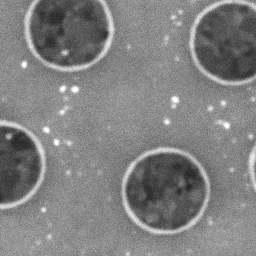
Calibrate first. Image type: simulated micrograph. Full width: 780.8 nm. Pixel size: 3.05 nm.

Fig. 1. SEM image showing raised bodies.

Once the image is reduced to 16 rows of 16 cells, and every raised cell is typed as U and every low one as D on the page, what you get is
DDUUUUUDDDDDDUUU
DDUUUUUDDDDDUUUU
DDUUUUUDDDDDUUUU
DDUUUUDDDDDDUUUU
DDDDDDDDDDDDDUUU
DDDDDDDDDDDDDDDD
DDDDDDDDDDDDDDDD
DDDDDDDDDDDDDDDD
UUDDDDDDDDDDDDDD
UUUDDDDDDDUDDDDD
UUUDDDDDUUUUUDDD
UUDDDDDDUUUUUDDD
UDDDDDDDUUUUUDDD
DDDDDDDDUUUUDDDD
DDDDDDDDDDDDDDDD
DDDDDDDDDDDDDDDD